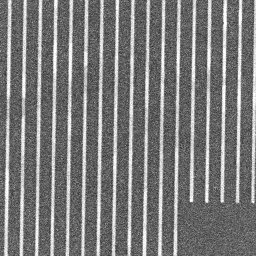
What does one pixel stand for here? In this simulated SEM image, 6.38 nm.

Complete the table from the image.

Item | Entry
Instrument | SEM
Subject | parallel lines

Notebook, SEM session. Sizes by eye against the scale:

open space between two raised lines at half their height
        12.6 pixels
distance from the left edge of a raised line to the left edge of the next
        0.0981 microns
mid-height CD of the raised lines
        0.0151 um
